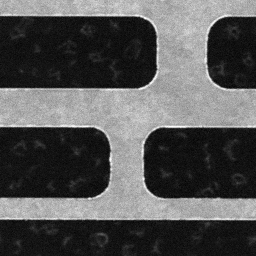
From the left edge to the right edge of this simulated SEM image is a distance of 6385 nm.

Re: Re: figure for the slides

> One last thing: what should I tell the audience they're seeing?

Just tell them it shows one or a few lines or trenches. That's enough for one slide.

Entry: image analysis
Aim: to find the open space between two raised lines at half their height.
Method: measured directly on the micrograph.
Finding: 1.8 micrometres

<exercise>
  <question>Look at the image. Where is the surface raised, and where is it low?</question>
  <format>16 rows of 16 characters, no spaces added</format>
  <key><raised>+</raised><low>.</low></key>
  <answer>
++++++++++++++++
.........++++...
..........+++...
..........+++...
..........+++...
.........+++++..
++++++++++++++++
++++++++++++++++
.......++.......
.......++.......
.......++.......
.......++.......
++++++++++++++++
++++++++++++++++
................
................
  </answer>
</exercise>